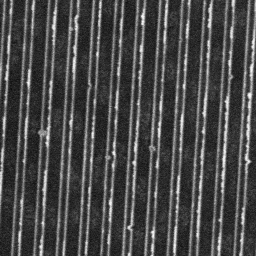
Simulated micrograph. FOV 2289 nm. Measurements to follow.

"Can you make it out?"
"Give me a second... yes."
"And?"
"parallel lines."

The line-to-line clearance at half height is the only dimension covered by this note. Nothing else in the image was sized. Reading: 128 nm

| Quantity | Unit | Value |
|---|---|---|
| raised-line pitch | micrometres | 0.198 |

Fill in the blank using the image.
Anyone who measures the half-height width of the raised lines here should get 0.0692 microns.